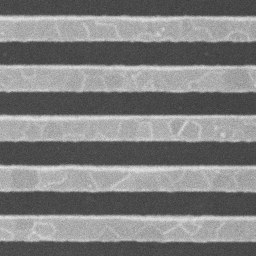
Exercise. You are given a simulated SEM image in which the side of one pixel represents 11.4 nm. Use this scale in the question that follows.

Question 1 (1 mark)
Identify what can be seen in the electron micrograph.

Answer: lines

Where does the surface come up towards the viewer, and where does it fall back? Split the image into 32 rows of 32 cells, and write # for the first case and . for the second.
................................
................................
################################
################################
################################
................................
................................
................................
################################
################################
################################
................................
................................
................................
##.#.....######.################
################################
################################
################################
................................
................................
................................
################################
################################
################################
................................
................................
................................
################################
################################
################################
................................
................................